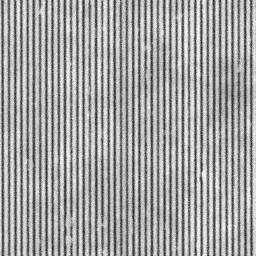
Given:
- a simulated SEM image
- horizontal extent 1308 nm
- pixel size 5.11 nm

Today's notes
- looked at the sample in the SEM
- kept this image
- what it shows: parallel lines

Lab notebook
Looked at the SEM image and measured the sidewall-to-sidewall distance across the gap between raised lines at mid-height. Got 12.8 nm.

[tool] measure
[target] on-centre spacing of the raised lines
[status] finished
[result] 31.8 nm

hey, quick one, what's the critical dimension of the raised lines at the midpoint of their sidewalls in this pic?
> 21.7 nm